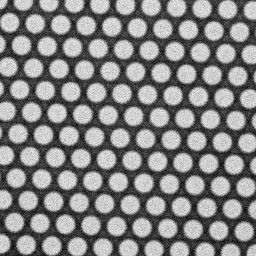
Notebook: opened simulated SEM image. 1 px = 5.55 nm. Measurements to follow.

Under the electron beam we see an array of small figures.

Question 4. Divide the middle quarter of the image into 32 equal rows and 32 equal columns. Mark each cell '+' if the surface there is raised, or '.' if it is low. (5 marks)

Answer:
+..++++...+++...++++...+++....++
+..++++..+++++..++++..++++...+++
+..++++..+++++..++++..+++++.++++
....++....+++...++++..++++...+++
..............................++
++++...+++...+++................
++++..++++..+++++..++++...+++...
++++..++++..+++++..++++..++++..+
+++...++++..++++...++++..++++..+
..............++....++....+++...
....++..........................
...++++..++++...+++...+++.....+.
+.+++++..++++..+++++..++++..++++
...++++..++++..+++++..++++..++++
...+++....+++...+++...++++..++++
.......................++....+++
+++...+++....++.................
+++..+++++..++++...+++...++++...
+++..+++++..++++..+++++..++++..+
+++...+++...++++..+++++..++++..+
.............++....+++...++++..+
....+...........................
..++++...+++....++....+++....+..
..++++..+++++..++++..++++...++++
..++++..+++++..++++..+++++..++++
...+++...+++...++++..++++...++++
......................++....+++.
++....+++....+..................
+++..++++...++++..++++...+++...+
+++..++++..+++++..++++..+++++..+
+++..++++...++++..++++..+++++..+
............+++...++++...+++...+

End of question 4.